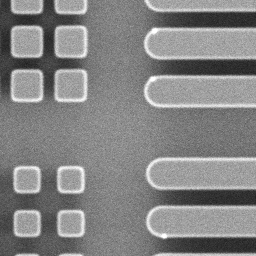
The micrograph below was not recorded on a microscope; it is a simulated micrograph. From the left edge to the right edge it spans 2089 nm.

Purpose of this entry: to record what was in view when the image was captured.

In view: groups of lines, slits or small figures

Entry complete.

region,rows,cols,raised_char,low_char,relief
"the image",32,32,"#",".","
.####..####.......##############
..###..###......................
................................
..###..###......................
.####..####.......##############
.####..####.......##############
.####..####.......##############
................................
................................
.####..####.....................
.####..####.......##############
.####..####.......##############
..###..###.........#############
................................
................................
................................
................................
................................
................................
................................
...................#############
..###..###........##############
..###..###.........#############
..###..###..........############
................................
................................
..###...##.........#############
..###..###........##############
..###..###.........#############
....................#########...
................................
................................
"